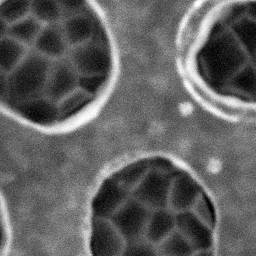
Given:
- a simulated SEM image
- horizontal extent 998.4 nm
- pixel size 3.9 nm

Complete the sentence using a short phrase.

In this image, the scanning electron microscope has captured holes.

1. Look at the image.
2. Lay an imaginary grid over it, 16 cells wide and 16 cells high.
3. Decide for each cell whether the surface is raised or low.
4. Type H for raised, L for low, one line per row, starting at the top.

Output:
LLLLLLHHHHHHHHLL
LLLLLLHHHHHHHLLL
LLLLLLLHHHHHHLLL
LLLLLLLHHHHHLLLL
LLLLLLLHHHHHLLLL
LLLLLLLHHHHHHLLL
LLLLLLHHHHHHHHHL
HHLLHHHHHHHHHHHH
HHHHHHHHHHHHHHHH
HHHHHHHHHHHHHHHH
HHHHHHHHLLLHHHHH
HHHHHHLLLLLLHHHH
HHHHHHLLLLLLLHHH
HHHHHHLLLLLLLHHH
HHHHHHLLLLLLLHHH
HHHHHHLLLLLLLHHH